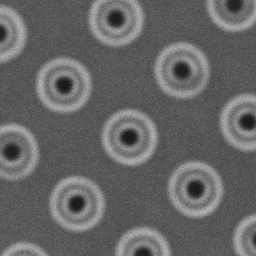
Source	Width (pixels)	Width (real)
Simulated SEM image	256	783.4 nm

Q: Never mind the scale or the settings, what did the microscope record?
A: ring-shaped raised bodies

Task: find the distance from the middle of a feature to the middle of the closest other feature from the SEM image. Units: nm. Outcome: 259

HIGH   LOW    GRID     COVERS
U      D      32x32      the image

DDDDDDDDDDDDUUUUUDDDDDDDDDUUDDUU
UDDDDDDDDDDUUUDUUUDDDDDDDDUUUDUU
UUDDDDDDDDDUUDDDUUDDDDDDDDDUUUUU
DUUDDDDDDDDUUUDUUUDDDDDDDDDDUUUD
DUUDDDDDDDDDUUUUUDDDDDDDDDDDDDDD
UUUDDDDDDDDDDDUDDDDDDDDDDDDDDDDD
UUDDDDDDDDDDDDDDDDDDUUUUUDDDDDDD
DDDDDDDUUDDDDDDDDDDDUUUUUUDDDDDD
DDDDDUUUUUDDDDDDDDDDUUDDUUDDDDDD
DDDDDUUUUUUDDDDDDDDDUUDDUUDDDDDD
DDDDDUUDDUUDDDDDDDDDUUUUUUDDDDDD
DDDDDUUDDUUDDDDDDDDDDUUUUDDDDDDD
DDDDDUUUUUUDDDDDDDDDDDDDDDDDDUUU
DDDDDDUUUUDDDDDDDDDDDDDDDDDDUUUU
DDDDDDDDDDDDDDUUUUDDDDDDDDDDUUDD
DDDDDDDDDDDDDUUUUUUDDDDDDDDDUUDD
UUUDDDDDDDDDDUUDDUUDDDDDDDDDUUUU
UUUUDDDDDDDDDUUDDUUDDDDDDDDDDUUU
UDUUUDDDDDDDDUUUUUUDDDDDDDDDDDUU
DDUUUDDDDDDDDDUUUUUDDDDDDDDDDDDD
UUUUDDDDDDDDDDDDUDDDDDDUUDDDDDDD
UUUUDDDDDDDDDDDDDDDDDDUUUUUDDDDD
DDDDDDDDUUUDDDDDDDDDDUUUUUUDDDDD
DDDDDDDUUUUUDDDDDDDDDUUDDDUUDDDD
DDDDDDDUUDUUUDDDDDDDDUUUDUUUDDDD
DDDDDDUUUDDUUDDDDDDDDDUUUUUDDDDD
DDDDDDDUUDUUUDDDDDDDDDDUUUDDDDDD
DDDDDDDUUUUUDDDDDDDDDDDDDDDDDDDU
DDDDDDDDDUUDDDDDDDDDDDDDDDDDDDUU
DDDDDDDDDDDDDDDDUUUUDDDDDDDDDUUU
DDUUDDDDDDDDDDDUUUUUUDDDDDDDDUUU
DUUUUDDDDDDDDDDUUDDUUDDDDDDDDDUU